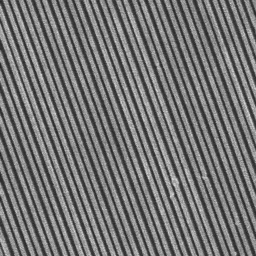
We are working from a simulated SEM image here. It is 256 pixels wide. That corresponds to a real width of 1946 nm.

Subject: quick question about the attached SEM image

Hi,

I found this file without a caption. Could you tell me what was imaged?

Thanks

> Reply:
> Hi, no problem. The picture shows parallel lines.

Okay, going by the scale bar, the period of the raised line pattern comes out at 7.58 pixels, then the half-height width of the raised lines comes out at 29.4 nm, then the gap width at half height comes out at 22.3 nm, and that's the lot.